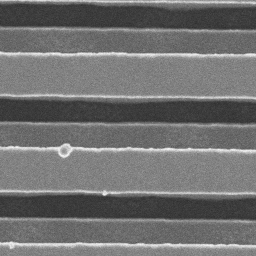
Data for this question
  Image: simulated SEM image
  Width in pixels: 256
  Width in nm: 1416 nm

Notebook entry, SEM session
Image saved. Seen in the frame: lines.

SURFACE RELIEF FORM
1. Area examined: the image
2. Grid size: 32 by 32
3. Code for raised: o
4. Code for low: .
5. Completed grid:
................................
................................
................................
................................
oooooooooooooooooooooooooooooooo
oooooooooooooooooooooooooooooooo
oooooooooooooooooooooooooooooooo
oooooooooooooooooooooooooooooooo
oooooooooooooooooooooooooooooooo
oooooooooooooooooooooooooooooooo
oooooooooooooooooooooooooooooooo
oooooooooooooooooooooooooooooooo
................................
................................
................................
ooooooooooooo..ooo..............
oooooooooooooooooooooooooooooooo
oooooooooooooooooooooooooooooooo
oooooooooooooooooooooooooooooooo
oooooooooooooooooooooooooooooooo
oooooooooooooooooooooooooooooooo
oooooooooooooooooooooooooooooooo
oooooooooooooooooooooooooooooooo
oooooooooooooooooooooooooooooooo
................................
................................
................................
oooooooooooo....................
oooooooooooooooooooooooooooooooo
oooooooooooooooooooooooooooooooo
oooooooooooooooooooooooooooooooo
oooooooooooooooooooooooooooooooo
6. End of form